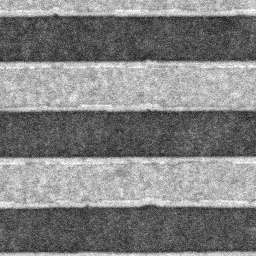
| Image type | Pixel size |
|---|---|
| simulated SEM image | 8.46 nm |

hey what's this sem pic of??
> one or a few lines or trenches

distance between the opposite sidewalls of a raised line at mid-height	378	nm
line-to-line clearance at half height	433	nanometres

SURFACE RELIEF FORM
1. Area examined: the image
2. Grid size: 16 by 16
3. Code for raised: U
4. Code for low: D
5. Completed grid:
UUUUUUUUUUUUUUUU
DDDDDDDDDDDDDDDD
DDDDDDDDDDDDDDDD
DDDDDDDDDDDDDDDD
UUUUUUUUUUUUUUUU
UUUUUUUUUUUUUUUU
UUUUUUUUUUUUUUUU
DDDDDDDDDDDDDDDD
DDDDDDDDDDDDDDDD
DDDDDDDDDDDDDDDD
UUUUUUUUUUUUUUUU
UUUUUUUUUUUUUUUU
UUUUUUUUUUUUUUUU
DDDDDDDDDDDDDDDD
DDDDDDDDDDDDDDDD
DDDDDDDDDDDDDDDD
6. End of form